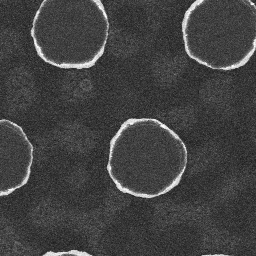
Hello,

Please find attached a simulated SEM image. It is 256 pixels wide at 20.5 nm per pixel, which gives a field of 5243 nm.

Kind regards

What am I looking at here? raised bodies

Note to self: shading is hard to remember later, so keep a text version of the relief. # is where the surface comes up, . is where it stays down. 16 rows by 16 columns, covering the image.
..####......####
..#####.....####
..#####.....####
...###......####
................
................
................
........##......
##.....####.....
##.....#####....
##.....#####....
#......####.....
................
................
................
................